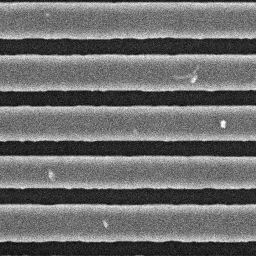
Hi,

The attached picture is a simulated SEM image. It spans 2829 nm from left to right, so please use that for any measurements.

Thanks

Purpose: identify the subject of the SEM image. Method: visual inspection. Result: lines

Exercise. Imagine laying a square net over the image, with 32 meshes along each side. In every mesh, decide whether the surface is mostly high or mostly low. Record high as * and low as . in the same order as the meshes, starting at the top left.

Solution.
********************************
********************************
********************************
********************************
********************************
................................
................................
********************************
********************************
********************************
********************************
................................
................................
********************************
********************************
********************************
********************************
********************************
................................
................................
********************************
********************************
********************************
..*.....*.********.*************
................................
................................
********************************
********************************
********************************
********************************
................................
................................